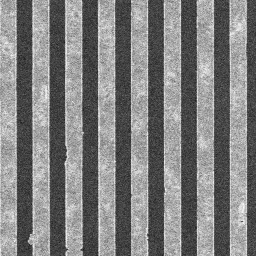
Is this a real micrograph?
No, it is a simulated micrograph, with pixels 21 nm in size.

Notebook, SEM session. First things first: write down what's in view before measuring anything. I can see parallel lines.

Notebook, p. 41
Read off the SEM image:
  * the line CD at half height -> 336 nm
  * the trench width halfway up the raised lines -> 354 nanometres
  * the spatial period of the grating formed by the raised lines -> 691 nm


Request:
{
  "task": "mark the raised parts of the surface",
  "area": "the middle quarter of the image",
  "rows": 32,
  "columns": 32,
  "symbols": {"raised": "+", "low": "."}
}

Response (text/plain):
.+++.....++++....++++....++++...
.+++.....++++....++++....++++...
.+++.....++++....++++....++++...
.+++.....++++....++++....++++...
.+++.....++++....++++....++++...
.+++.....++++....++++....++++...
.+++.....++++....++++....++++...
.+++.....++++....++++....++++...
.+++.....++++....++++....++++...
.+++.....++++....++++....++++...
.+++.....++++....++++....++++...
.+++.....++++....++++....++++...
.+++.....++++....++++....++++...
.+++.....++++....++++....++++...
.+++.....++++....++++....++++...
.+++.....++++....++++....++++...
.+++.....++++....++++....++++...
.++++....++++....++++....++++...
.+++.....++++....++++....++++...
.+++.....++++....++++....++++...
.+++.....++++....++++....++++...
.+++.....++++....++++....++++...
.+++.....++++....++++....++++...
.+++.....++++....++++....++++...
.+++.....++++....++++....++++...
++++.....++++....++++....++++...
.+++.....++++....++++....++++...
.+++.....+++.....++++....++++...
.+++.....+++.....++++....++++...
.+++.....++++....++++....++++...
.+++.....+++.....++++....++++...
.+++.....+++.....++++....++++...